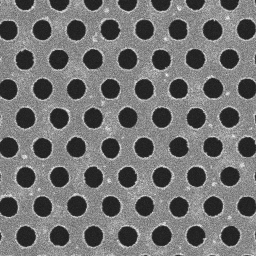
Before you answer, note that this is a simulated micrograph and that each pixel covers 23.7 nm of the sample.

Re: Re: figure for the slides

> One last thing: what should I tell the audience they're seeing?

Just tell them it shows a regular array of holes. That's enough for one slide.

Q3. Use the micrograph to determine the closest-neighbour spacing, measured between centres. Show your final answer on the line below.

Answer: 794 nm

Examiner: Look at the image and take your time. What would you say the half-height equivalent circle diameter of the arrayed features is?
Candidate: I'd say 476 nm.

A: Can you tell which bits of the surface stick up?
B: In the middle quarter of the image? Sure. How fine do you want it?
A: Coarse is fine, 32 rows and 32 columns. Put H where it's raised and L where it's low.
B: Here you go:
LHHHHLLLLHHHHHLLLLHHHHLLLLHHHHHL
HHHHHHHLHHHHHHHHHHHHHHHHLHHHHHHH
HHHHHHHHHHHHHHHHHHHHHHHHHHHHHHHH
HHHHHHHHHHHHHHHHHHHHHHHHHHHHHHHH
HHLLLHHHHHLLLHHHHHLLLLHHHHHLLLHH
HLLLLHHHHLLLLLHHHHLLLLHHHHLLLLLH
HLLLLLHHHLLLLLHHHHLLLLLHHHLLLLLH
HLLLLHHHHHLLLLHHHHLLLLHHHHHLLLLH
HHLLHHHHHHHLLHHHHHHLLLHHHHHLLLHH
HHHHHHHHHHHHHHHHHHHHHHHHHHHHHHHH
HHHHHHHHHHHHHHHHHHHHHHHHHHHHHHHH
HHHHHHLLLHHHHHLLLLHHHHHLLLHHHHHH
LHHHHLLLLLHHHHLLLLHHHHLLLLLHHHHL
LHHHHLLLLLHHHLLLLLLHHHLLLLLHHHHL
LHHHHLLLLLHHHHLLLLHHHHLLLLLHHHHL
HHHHHHLLLHHHHHHLLHHHHHHLLLHHHHHL
HHHHHHHHHHHHHHHHHHHHHHHHHHHHHHHH
HHHHHHHHHHHHHHHHHHHHHHHHHHHHHHHH
HHLLHHHHHHHLHHHHHHHLLHHHHHHHLLHH
HLLLLHHHHHLLLLHHHHLLLLHHHHHLLLLH
HLLLLLHHHLLLLLHHHHLLLLHHHHLLLLLH
HLLLLHHHHLLLLLHHHHLLLLHHHHLLLLLH
HLLLLHHHHHLLLLHHHHLLLLHHHHHLLLLH
HHHHHHHHHHHLHHHHHHHHHHHHHHHHHHHH
HHHHHHHHHHHHHHHHHHHHHHHHHHHHHHHH
HHHHHHHHHHHHHHHHHHHHHHHHHHHHHHHH
LHHHHHLLLHHHHHLLLLHHHHHLLLHHHHHL
LHHHHLLLLLHHHLLLLLHHHHLLLLLHHHHL
LHHHHLLLLLHHHLLLLLHHHHLLLLLHHHHL
LHHHHLLLLLHHHHLLLLHHHHLLLLLHHHHL
HHHHHHLLLHHHHHHLLHHHHHHLLLHHHHHH
HHHHHHHHHHHHHHHHHHHHHHHHHHHHHHHH